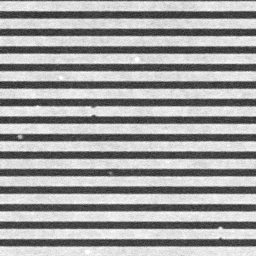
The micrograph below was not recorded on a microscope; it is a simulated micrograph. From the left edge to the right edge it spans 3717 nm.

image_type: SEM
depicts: parallel lines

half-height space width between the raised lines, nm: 122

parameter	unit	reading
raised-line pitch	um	0.254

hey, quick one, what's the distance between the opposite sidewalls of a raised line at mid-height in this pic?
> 129 nm